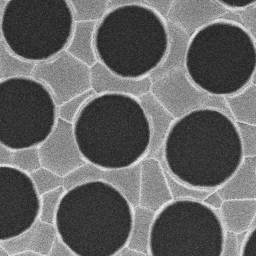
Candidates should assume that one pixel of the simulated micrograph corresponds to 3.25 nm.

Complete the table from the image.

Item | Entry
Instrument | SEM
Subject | holes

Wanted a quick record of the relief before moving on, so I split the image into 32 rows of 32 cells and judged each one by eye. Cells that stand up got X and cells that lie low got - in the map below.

X-------XXXXXXXXXXXXXXXXXXXX---X
---------XXXXX-----XXXXXXXXXXXXX
---------XXXX-------XXXXXXXXXXXX
---------XXX---------XXXX-----XX
---------XXX---------XXX-------X
X-------XXXX---------XXX--------
XX-----XXXXX---------XX---------
XXXXXXXXXXXXX-------XXX---------
XXXXXXXXXXXXXX-----XXXX---------
XXXXXXXXXXXXXXX---XXXXXX-------X
-----XXXXXXXXXXXXXXXXXXXX------X
------XXXXXXXXXXXXXXXXXXXX---XXX
-------XXXXX-----XXXXXXXXXXXXXXX
-------XXX--------XXXXXXXXXXXXXX
-------XXX--------XXXXX-----XXXX
-------XX----------XXX-------XXX
------XXX----------XX---------XX
------XXX----------XX---------XX
X--XXXXXXX--------XXX---------XX
XXXXXXXXXX--------XXX---------XX
XXXXXXXXXXXX----XXXXX---------XX
---XXXXXXXXXXXXXXXXXXX-------XXX
----XXXXXXXXXXXXXXXXXXX-----XXXX
----XXXXX-----XXXXXXXXXXXXXXXXXX
-----XXX-------XXXXXXXXXXXXXXXXX
-----XX---------XXXXX----XXXXXXX
-----XX---------XXXX-------XXXXX
----XXX----------XX--------XXXXX
----XXX----------XX---------XXXX
--XXXXXX--------XXX---------XXX-
XXXXXXXX--------XXX---------XXX-
XXXXXXXXX------XXXX---------XX--